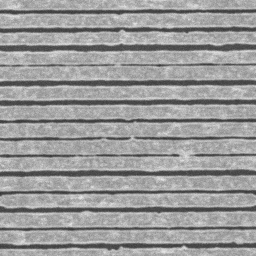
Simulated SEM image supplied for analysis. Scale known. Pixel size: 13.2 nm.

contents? parallel lines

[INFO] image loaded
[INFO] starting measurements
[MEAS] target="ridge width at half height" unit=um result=0.168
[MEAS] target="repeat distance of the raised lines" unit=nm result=238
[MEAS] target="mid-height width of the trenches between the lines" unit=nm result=70.9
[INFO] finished